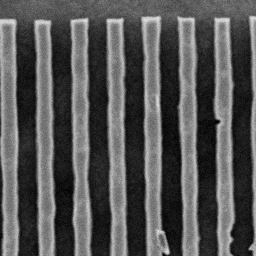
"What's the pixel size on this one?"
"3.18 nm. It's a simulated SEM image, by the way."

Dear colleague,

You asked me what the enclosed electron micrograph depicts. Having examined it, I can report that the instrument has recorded parallel lines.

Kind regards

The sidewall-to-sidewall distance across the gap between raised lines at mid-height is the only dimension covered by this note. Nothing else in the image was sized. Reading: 20.5 pixels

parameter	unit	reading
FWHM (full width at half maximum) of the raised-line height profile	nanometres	48.5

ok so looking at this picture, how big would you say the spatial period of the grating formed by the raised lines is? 114 nanometers